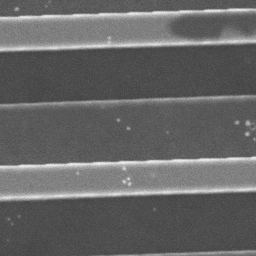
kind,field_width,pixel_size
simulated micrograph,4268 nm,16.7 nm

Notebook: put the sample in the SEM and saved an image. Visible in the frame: lines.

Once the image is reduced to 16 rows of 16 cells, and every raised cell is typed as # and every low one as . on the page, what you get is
################
################
################
................
................
................
..##############
################
################
################
################
################
................
................
................
................